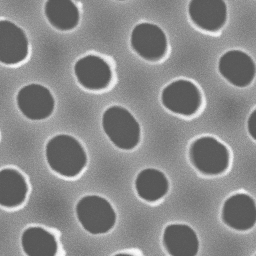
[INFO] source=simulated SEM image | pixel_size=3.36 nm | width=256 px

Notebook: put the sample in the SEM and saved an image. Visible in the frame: a regular array of holes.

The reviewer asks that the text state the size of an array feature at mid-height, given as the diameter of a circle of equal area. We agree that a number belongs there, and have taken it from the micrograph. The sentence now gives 0.124 microns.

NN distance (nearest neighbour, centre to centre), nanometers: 214